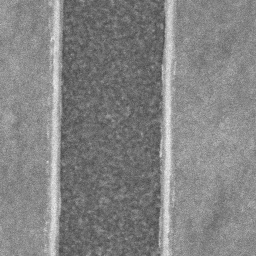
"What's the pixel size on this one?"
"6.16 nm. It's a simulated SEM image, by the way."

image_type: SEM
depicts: one or a few lines or trenches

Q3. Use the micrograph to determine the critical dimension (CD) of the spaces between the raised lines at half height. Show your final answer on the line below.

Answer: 698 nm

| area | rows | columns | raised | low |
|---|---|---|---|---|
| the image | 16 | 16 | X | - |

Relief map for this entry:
XXXX-------XXXXX
XXXX-------XXXXX
XXXX-------XXXXX
XXXX-------XXXXX
XXXX-------XXXXX
XXX--------XXXXX
XXX-------XXXXXX
XXX-------XXXXXX
XXX--------XXXXX
XXX-------XXXXXX
XXX-------XXXXXX
XXX-------XXXXXX
XXX-------XXXXXX
XXX-------XXXXXX
XXX-------XXXXXX
XXX-------XXXXXX